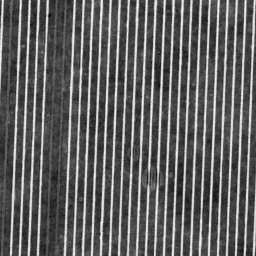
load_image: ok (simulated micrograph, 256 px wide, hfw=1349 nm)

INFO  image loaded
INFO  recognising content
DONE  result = parallel lines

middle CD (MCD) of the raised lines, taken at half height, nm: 7.9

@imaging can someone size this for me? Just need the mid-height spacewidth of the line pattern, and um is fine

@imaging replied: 0.0388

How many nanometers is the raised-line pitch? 47.4